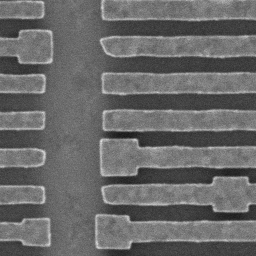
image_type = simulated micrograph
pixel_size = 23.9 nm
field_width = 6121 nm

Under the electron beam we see wiring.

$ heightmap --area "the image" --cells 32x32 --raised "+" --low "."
+++++........+++++++++++++++++++
+++++........+++++++++++++++++++
................................
................................
..++++..........................
+++++++......+++++++++++++++++++
+++++++......+++++++++++++++++++
..++++..........................
................................
+++++........+++++++++++++++++++
++++++.......+++++++++++++++++++
.++++........++++++++++++++++++.
................................
................................
++++++.......+++++++++++++++++++
++++++.......+++++++++++++++++++
................................
.............++++...............
.............+++++++++++++++++++
++++++.......+++++++++++++++++++
+++++........+++++++++++++++++++
.............++++...............
...........................++++.
+++++........+++++++++++++++++++
++++++.......+++++++++++++++++++
+.............++++++++.+++++++++
................................
...+++......++++................
++++++......++++++++++++++++++++
++++++......++++++++++++++++++++
...+++......++++................
................................